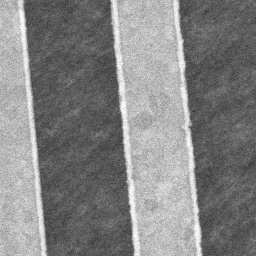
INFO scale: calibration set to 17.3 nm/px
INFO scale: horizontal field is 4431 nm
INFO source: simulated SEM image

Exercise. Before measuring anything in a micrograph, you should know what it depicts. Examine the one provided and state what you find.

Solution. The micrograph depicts one or a few lines or trenches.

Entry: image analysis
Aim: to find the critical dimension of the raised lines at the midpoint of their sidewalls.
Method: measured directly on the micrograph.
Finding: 1.07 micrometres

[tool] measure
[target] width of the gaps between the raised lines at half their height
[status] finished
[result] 1610 nm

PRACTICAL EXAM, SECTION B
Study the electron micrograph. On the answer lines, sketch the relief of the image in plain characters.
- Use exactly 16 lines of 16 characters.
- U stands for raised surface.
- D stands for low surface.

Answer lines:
UDDDDDDUUUUDDDDD
UDDDDDDUUUUDDDDD
UUDDDDDUUUUDDDDD
UUDDDDDUUUUDDDDD
UUDDDDDUUUUDDDDD
UUDDDDDDUUUDDDDD
UUDDDDDDUUUUDDDD
UUDDDDDDUUUUDDDD
UUDDDDDDUUUUDDDD
UUDDDDDDUUUUDDDD
UUDDDDDDUUUUDDDD
UUDDDDDDUUUUDDDD
UUDDDDDDUUUUDDDD
UUUDDDDDUUUUDDDD
UUUDDDDDUUUUDDDD
UUUDDDDDDUUUDDDD